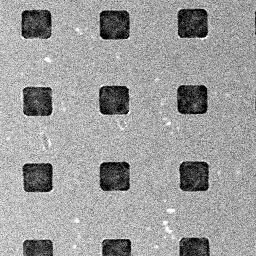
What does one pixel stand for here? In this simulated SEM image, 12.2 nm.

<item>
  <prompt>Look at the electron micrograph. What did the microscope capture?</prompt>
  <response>a regular array of holes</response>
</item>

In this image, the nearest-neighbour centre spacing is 929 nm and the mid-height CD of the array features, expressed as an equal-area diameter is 403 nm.